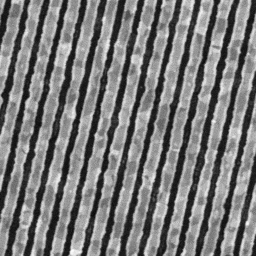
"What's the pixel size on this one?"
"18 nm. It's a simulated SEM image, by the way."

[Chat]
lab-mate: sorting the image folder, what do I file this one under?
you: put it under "parallel lines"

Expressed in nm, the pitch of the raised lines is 334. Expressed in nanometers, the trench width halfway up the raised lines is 152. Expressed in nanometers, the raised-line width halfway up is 185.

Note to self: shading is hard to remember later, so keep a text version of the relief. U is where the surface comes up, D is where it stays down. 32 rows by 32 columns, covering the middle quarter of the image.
DDDUUDDUUUDDUUUDDUUDDUUUDDUUUDDU
DDUUUDDUUUDUUUDDUUUDDUUUDDUUUDDU
DDUUUDDUUDDUUUDDUUUDDUUDDUUUDDUU
DDUUDDDUUDDUUUDDUUUDDUUDDDUUDDUU
DDUUDDUUUDDUUUDDUUDDDUUDDUUUDDUU
DDUUDDUUUDDUUDDDUUDDDUUDDUUUDDUU
DUUDDDUUUDDUUDDUUUDDDUUDDUUDDDUU
DUUDDDUUDDUUUDDUUUDDUUDDDUUDDUUU
DUUDDDUUDDUUUDDUUUDDUUUDUUUDDUUU
DUUDDUUUDDUUUDDUUDDUUUDDUUUDDUUD
DUUDDUUUDUUUDDDUUDDUUUDDUUDDDUUD
UUDDDUUDDUUUDDUUUDDUUUDDUUDDUUUD
UUUDDUUDDUUUDDUUUDDUUDDDUUDDUUUD
UUDDUUUDDUUDDDUUDDUUUDDUUUDDUUUD
UUDDUUUDDUUDDDUUDDUUUDDUUUDDUUDD
UUDDUUDDDUUDDDUUDDUUUDDUUDDDUUDD
UUDDUUDDDUUDDUUUDDUUUDDUUDDUUUDD
UDDDUUDDUUDDDUUDDDUUDDUUUDDUUUDD
UDDUUUDDUUUDDUUDDUUUDDUUUDDUUDDD
UDDUUDDDUUDDUUUDDUUUDDUUDDDUUDDU
UDDUUDDDUUDDUUUDDUUUDDUUDDDUUDDU
DDUUUDDDUUDDUUUDDUUDDUUUDDUUUDDU
DDUUUDDUUUDUUUDDUUUDDUUUDDUUDDDU
DDUUUDDUUUDUUUDDUUUDDUUUDDUUDDDU
DDUUUDUUUDDUUUDDUUUDDUUDDDUUDDDU
DDUUDDUUUDDUUUDDUUDDUUUDDUUUDDUU
DUUUDDUUUDDUUDDDUUDDUUUDDUUUDDUU
DUUUDDUUUDUUUDDUUUDDUUUDDUUDDDUU
DUUUDDUUDDUUUDDUUUDDUUDDDUUDDUUU
DUUDDDUUDDUUUDDUUDDDUUDDDUUDDUUU
UUUDDUUUDDUUDDDUUDDUUUDDUUDDDUUU
UUUDDUUUDDUUDDDUUDDUUUDDUUDDDUUD